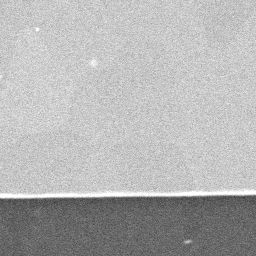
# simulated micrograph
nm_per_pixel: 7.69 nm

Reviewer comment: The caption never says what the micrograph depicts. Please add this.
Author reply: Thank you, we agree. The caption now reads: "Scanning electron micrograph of wiring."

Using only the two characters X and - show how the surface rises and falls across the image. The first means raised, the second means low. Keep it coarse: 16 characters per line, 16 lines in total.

XXXXXXXXXXXXXXXX
XXXXXXXXXXXXXXXX
XXXXXXXXXXXXXXXX
XXXXXXXXXXXXXXXX
XXXXXXXXXXXXXXXX
XXXXXXXXXXXXXXXX
XXXXXXXXXXXXXXXX
XXXXXXXXXXXXXXXX
XXXXXXXXXXXXXXXX
XXXXXXXXXXXXXXXX
XXXXXXXXXXXXXXXX
XXXXXXXXXXXXXXXX
----------------
----------------
----------------
----------------